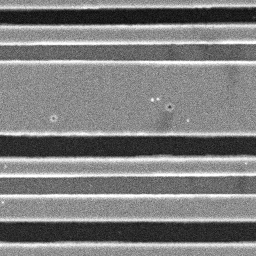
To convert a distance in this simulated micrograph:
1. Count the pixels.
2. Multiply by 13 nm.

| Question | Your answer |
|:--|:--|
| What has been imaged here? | lines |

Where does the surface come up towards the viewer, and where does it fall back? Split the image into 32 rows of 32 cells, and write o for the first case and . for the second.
oooooooooooooooooooooooooooooooo
................................
................................
oooooooooooooooooooooooooooooooo
oooooooooooooooooooooooooooooooo
oooooooooooooooooooooooooooooooo
oooooooooooooooooooooooooooooooo
oooooooooooooooooooooooooooooooo
oooooooooooooooooooooooooooooooo
oooooooooooooooooooooooooooooooo
oooooooooooooooooooooooooooooooo
oooooooooooooooooooooooooooooooo
oooooooooooooooooooooooooooooooo
oooooooooooooooooooooooooooooooo
oooooooooooooooooooooooooooooooo
oooooooooooooooooooooooooooooooo
oooooooooooooooooooooooooooooooo
................................
................................
................................
oooooooooooooooooooooooooooooooo
oooooooooooooooooooooooooooooooo
oooooooooooooooooooooooooooooooo
oooooooooooooooooooooooooooooooo
oooooooooooooooooooooooooooooooo
oooooooooooooooooooooooooooooooo
oooooooooooooooooooooooooooooooo
oooooooooooooooooooooooooooooooo
................................
................................
oooooooooooooooooooooooooooooooo
oooooooooooooooooooooooooooooooo